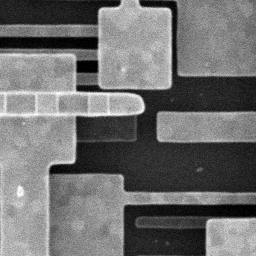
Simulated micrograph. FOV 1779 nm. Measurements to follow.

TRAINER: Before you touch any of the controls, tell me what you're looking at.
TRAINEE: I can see wiring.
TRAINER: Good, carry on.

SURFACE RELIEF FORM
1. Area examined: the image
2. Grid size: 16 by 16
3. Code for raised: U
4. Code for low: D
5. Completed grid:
DDDDDDDUUDDDDDDD
DDDDDDUUUUUDDDDD
DDDDDDUUUUUDDDDD
UUUUDDUUUUUDDDDD
UUUUUDUUUUUDDDDD
UUUUUDUUUUDDDDDD
UUUUUUUUUDDDDDDD
UUUUUDDDDDDDDDDD
UUUUUDDDDDDDDDDD
UUUUUDDDDDDDDDDD
UUUDDDDDDDDDDDDD
UUUDDDDDDDDDDDDD
UUUDDDDDDDDDDDDD
UUUDDDDDDDDDDDDD
UUUDDDDDDDDDDUUU
UUUDDDDDDDDDDUUU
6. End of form